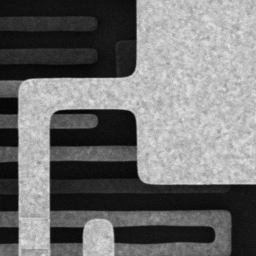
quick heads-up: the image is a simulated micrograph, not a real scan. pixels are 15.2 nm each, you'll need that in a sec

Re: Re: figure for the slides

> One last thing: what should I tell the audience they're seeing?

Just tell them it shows wiring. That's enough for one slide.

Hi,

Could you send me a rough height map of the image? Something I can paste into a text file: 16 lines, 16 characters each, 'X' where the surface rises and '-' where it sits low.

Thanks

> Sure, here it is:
---------XXXXXXX
---------XXXXXXX
---------XXXXXXX
---------XXXXXXX
--------XXXXXXXX
-XXXXXXXXXXXXXXX
-XXXXXXXXXXXXXXX
-XX-----XXXXXXXX
-XX------XXXXXXX
-XX------XXXXXXX
-XX------XXXXXXX
-XX------XXXXXXX
-XX-------------
-XX-------------
-XX--XX---------
-XX--XX---------